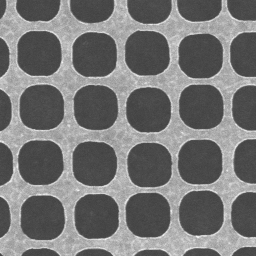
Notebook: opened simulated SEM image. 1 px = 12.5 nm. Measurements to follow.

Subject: a regular array of holes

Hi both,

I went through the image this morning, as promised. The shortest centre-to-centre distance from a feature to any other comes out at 661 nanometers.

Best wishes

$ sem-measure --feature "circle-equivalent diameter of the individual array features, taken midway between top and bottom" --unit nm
590